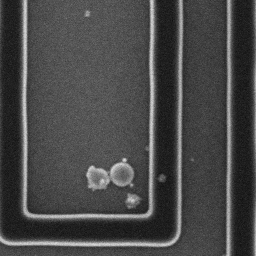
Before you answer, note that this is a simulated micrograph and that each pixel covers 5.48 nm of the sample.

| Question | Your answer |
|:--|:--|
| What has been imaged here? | groups of lines, slits or small figures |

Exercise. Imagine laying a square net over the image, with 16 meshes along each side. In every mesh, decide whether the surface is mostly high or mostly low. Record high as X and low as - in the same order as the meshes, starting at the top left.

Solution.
XX-------XX---XX
XX-------XX---XX
XX-------XX---XX
XX-------XX---XX
XX-------XX---XX
XX-------XX---XX
XX-------XX---XX
XX-------XX---XX
XX-------XX---XX
XX-------XX---XX
XX-------XX---XX
XX-------XX---XX
XX-------XX---XX
XXX-XXXXXXX---XX
XXXXXXXXXXX---XX
--------------XX